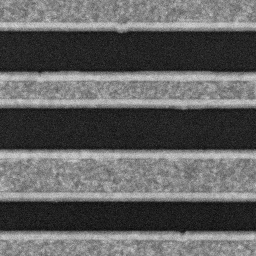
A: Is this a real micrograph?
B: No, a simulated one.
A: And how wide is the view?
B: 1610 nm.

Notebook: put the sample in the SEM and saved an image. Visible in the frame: one or a few lines or trenches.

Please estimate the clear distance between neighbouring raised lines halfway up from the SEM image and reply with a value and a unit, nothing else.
332 nanometres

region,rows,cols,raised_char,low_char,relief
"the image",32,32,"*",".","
********************************
********************************
********************************
................................
................................
................................
................................
................................
................................
................................
********************************
********************************
********************************
................................
................................
................................
................................
................................
................................
................................
********************************
********************************
********************************
********************************
................................
................................
................................
................................
................................
................................
********************************
********************************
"